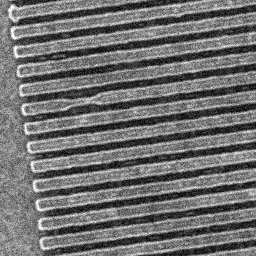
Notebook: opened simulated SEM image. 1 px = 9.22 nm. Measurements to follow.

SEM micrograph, parallel lines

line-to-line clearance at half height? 81.1 nanometres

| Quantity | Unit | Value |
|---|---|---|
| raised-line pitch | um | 0.178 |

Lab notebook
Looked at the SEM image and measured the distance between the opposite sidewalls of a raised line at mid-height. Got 99.3 nanometres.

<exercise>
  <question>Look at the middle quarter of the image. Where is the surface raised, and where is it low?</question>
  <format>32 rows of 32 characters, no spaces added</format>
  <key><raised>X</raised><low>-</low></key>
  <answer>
XXXXXXXX----------------XXXXXXXX
----------------XXXXXXXXXXXXXXXX
----------XXXXXXXXXXXXXXXXXXX---
--XXXXXXXXXXXXXXXXXX-X----------
XXXXXXXXXXXXX-----------------XX
XXXXXXX----------------XXXXXXXXX
--------------X-XXXXXXXXXXXXXXXX
---------XXXXXXXXXXXXXXXXXX-----
-------XXXXXXXXXXXXX------------
XXXXXXXXXXXXX---------------XXXX
XX--------------------XXXXXXXXXX
---------------XXXXXXXXXXXXXXXXX
-------XXXXXXXXXXXXXXXXXXX------
XXXXXXXXXXXXXXXXXXX-------------
XXXXXXXXXXXX---------------XXXXX
XXXXX-----------------XXXXXXXXXX
--------------XXXXXXXXXXXXXXXXX-
-------XXXXXXXXXXXXXXXXXXX------
XXXXXXXXXXXXXXXXXXX-------------
XXXXXXXXXXXX---------------XXXXX
XXX-----------------XXXXXXXXXXXX
-------------XXXXXXXXXXXXXXXXXX-
------XXXXXXXXXXXXXXXXXX--------
XXXXXXXXXXXXXXXXXX--------------
XXXXXXXXXXX----------------XXXXX
XXX---------------XXXXXXXXXXXXXX
------------XXXXXXXXXXXXXXXXXXXX
-----XXXXXXXXXXXXXXXXXXX--------
XXXXXXXXXXXXXXXXXX--------------
XXXXXXXXX-----------------XXXXXX
XX-----------------XXXXXXXXXXXXX
----------X-XXXXXXXXXXXXXXXXXX--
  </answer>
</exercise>